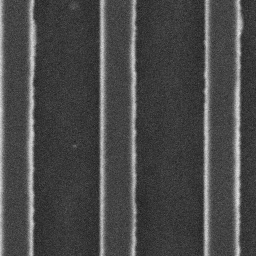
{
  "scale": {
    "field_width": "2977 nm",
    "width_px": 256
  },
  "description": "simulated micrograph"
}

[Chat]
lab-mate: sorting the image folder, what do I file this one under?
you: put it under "lines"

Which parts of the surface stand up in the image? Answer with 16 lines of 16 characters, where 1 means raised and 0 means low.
1100001100000110
1100001100000110
1100001100000110
1100001100000110
1100001100000110
1100001100000110
1100001100000110
1100001100000110
1100001100000110
1100001100000110
1100001100000110
1100001100000110
1100001100000110
1100001100000110
1100001100000110
1100001100000110